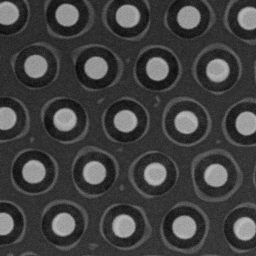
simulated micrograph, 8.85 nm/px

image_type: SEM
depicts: an array of small figures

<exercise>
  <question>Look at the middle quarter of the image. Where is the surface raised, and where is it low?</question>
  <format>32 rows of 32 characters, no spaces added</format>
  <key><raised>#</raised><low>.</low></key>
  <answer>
###..######...####...#####...###
###..######...####...#####...###
###...####....####...#####...###
###....##.....####....###....###
####.........######.........####
#####......#########.......#####
#####################....#######
################################
.##############.################
...##########.....#########.....
....########.......#######......
##...######.........#####.......
##....####...####....####....##.
###...####...#####...####...####
##....####...#####...####...####
#.....####...####....####...####
.....#####....###...#####....###
.....######.........######......
....########.......#######......
..############...###########....
################################
#####...########################
####.......#########.....#######
###.........#######.......######
###..........#####.........#####
##....####...####.....##....####
##...#####...####....####...####
##...#####...####...#####...####
##....####...####....####...####
###...###....####.....##....####
###.........######.........#####
####.......########.......######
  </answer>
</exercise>